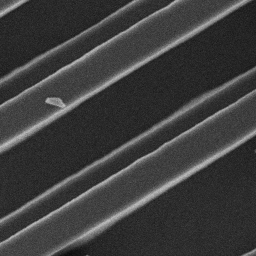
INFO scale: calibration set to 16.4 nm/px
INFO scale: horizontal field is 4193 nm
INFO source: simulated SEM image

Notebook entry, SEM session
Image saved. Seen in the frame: lines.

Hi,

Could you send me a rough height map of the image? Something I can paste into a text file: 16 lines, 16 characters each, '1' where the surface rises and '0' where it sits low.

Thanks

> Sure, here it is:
1000000000111110
0000000011111000
0000000111100000
0000011111000000
0001111100000000
0011110000000000
1111100000000011
1110000000000111
1000000000011111
0000000000111100
0000000011110000
0000001111100000
0000011110000000
0001111000000000
0111110000000000
1111000000000000